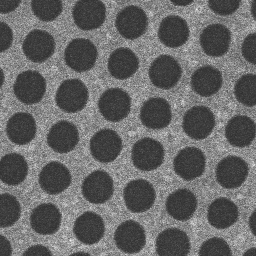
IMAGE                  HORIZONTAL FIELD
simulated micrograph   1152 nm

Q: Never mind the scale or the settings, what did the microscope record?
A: a regular array of holes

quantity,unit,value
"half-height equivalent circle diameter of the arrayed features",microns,0.143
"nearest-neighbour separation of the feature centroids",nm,188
